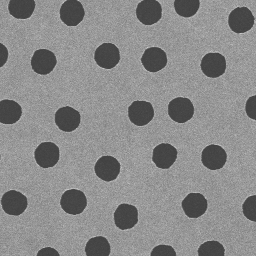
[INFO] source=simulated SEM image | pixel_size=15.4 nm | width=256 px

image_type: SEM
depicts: a regular array of holes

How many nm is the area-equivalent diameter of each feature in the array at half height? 396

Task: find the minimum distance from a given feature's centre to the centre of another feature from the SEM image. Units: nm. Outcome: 740